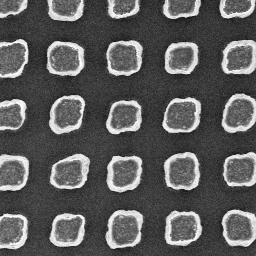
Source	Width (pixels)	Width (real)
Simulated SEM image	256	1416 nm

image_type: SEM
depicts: a regular array of raised bodies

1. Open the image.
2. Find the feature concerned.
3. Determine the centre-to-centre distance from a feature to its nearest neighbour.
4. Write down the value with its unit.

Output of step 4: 0.311 µm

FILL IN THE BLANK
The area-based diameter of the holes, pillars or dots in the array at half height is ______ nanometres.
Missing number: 183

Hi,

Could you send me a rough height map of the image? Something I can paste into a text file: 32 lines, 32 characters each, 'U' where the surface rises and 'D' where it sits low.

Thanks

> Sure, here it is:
UUUDDDUUUUDDDDUUUDDDDUUUUDDDUUUU
UUDDDDUUUUDDDDUUUDDDDUUUDDDDUUUD
DDDDDDDDDDDDDDDDDDDDDDDDDDDDDDDD
DDDDDDDDDDDDDDDDDDDDDDDDDDDDDDDD
DDDDDDDDDDDDDDDDDDDDDDDDDDDDDDDD
DUUDDDDUUDDDDDUUUDDDDDDDDDDDDDUD
UUUDDDUUUUDDDUUUUDDDDUUUDDDDUUUU
UUUDDDUUUUDDDDUUUUDDDUUUDDDDUUUU
UUUDDDUUUUDDDDUUUDDDDUUUDDDDUUUD
UDDDDDDDDDDDDDDDDDDDDDDDDDDDDDDD
DDDDDDDDDDDDDDDDDDDDDDDDDDDDDDDD
DDDDDDDDDDDDDDDDDDDDDDDDDDDDDDDD
DDDDDDDUUUDDDDDDDDDDDDUUDDDDDUUD
UUUDDDDUUUDDDDUUUDDDDUUUUDDDUUUU
UUUDDDDUUUDDDDUUUDDDDUUUUDDDUUUU
UUUDDDDUUUDDDUUUUDDDDUUUDDDDUUUD
DDDDDDDDDDDDDDDDDDDDDDDDDDDDDDDD
DDDDDDDDDDDDDDDDDDDDDDDDDDDDDDDD
DDDDDDDDDDDDDDDDDDDDDDDDDDDDDDDD
DDDDDDDDDDDDDDDDDDDDDDUUDDDDDUDU
UUUDDDDUUUUDDDUUUDDDDUUUUDDDUUUU
UUUDDDDUUUUDDDUUUDDDDUUUUDDDUUUU
UUUDDDDUUUDDDDUUUDDDDUUUUDDDUUUU
UUDDDDDDDDDDDDUUDDDDDDDUDDDDDDDD
DDDDDDDDDDDDDDDDDDDDDDDDDDDDDDDD
DDDDDDDDDDDDDDDDDDDDDDDDDDDDDDDD
DDDDDDDDDDDDDDDDDDDDDDDDDDDDDUDD
UUUDDDDUUUDDDDUUUDDDDUUUUDDDUUUU
UUUDDDDUUUDDDDUUUUDDDUUUUDDDUUUU
UUUDDDDUUUDDDDUUUDDDDUUUUDDDUUUU
UUUDDDDDUDDDDDUUUDDDDDDDDDDDDDDD
DDDDDDDDDDDDDDDDDDDDDDDDDDDDDDDD